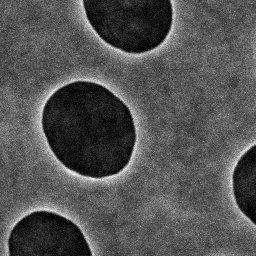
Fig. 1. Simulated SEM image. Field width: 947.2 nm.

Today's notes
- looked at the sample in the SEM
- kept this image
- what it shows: holes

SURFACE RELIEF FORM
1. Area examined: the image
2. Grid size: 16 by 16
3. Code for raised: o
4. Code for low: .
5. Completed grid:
ooooo......ooooo
oooooo.....ooooo
oooooo....oooooo
oooooooooooooooo
oooooooooooooooo
oooo...ooooooooo
ooo.....oooooooo
ooo.....oooooooo
ooo.....oooooooo
ooo.....ooooooo.
oooo....ooooooo.
ooooooooooooooo.
ooooooooooooooo.
oo..ooooooooooo.
o....ooooooooooo
o.....oooooooooo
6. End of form